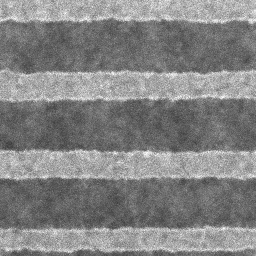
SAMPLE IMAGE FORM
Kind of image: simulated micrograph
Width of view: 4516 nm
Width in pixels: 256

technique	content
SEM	one or a few lines or trenches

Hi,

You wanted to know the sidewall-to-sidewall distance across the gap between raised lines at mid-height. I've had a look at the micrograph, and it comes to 942 nanometers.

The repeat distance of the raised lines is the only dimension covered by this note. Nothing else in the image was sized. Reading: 76.8 px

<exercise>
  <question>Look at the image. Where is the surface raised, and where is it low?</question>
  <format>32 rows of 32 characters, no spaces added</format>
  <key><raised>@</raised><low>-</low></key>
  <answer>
@@@@@@@@@@@@@@@@@@@@@@@@@@@@@@@@
@@@@@@@@@@@@@@@@@@@@@@@@@@@@@@@@
--@@-@@@-@-------@-----@@@@@@--@
--------------------------------
--------------------------------
--------------------------------
--------------------------------
--------------------------------
--------------------------------
@@@@@@@@@@@@@@@@@@@@@@@@@@@@@@@@
@@@@@@@@@@@@@@@@@@@@@@@@@@@@@@@@
@@@@@@@@@@@@@@@@@@@@@@@@@@@@@@@@
-@----@-------------------------
--------------------------------
--------------------------------
--------------------------------
--------------------------------
--------------------------------
--------------------------------
@@@@@@@@@@@@@@@@@@@@@@@@@@@@@@@@
@@@@@@@@@@@@@@@@@@@@@@@@@@@@@@@@
@@@@@@@@@@@@@@@@@@@@@@@@@@@@@@@@
--------------------------------
--------------------------------
--------------------------------
--------------------------------
--------------------------------
--------------------------------
--------------------------@-----
@@@@@@@@@@@@@@@@@@@@@@@@@@@@@@@@
@@@@@@@@@@@@@@@@@@@@@@@@@@@@@@@@
--------------------------------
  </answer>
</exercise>